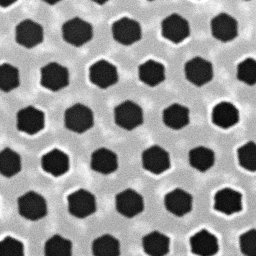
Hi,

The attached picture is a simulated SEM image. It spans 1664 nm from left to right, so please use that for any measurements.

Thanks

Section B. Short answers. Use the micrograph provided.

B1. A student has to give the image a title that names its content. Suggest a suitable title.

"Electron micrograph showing a regular array of holes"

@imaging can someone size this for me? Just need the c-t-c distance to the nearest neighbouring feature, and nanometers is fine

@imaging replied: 314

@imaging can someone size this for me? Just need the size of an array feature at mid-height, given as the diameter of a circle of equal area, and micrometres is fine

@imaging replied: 0.194